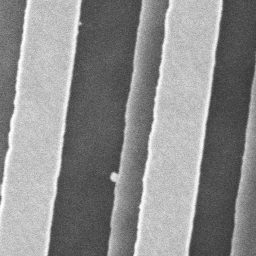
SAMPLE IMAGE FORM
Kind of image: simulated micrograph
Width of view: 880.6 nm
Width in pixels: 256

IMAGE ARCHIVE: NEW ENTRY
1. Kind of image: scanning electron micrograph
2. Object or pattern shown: lines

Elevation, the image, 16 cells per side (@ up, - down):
@@@@@----@@@@@--
@@@@@----@@@@@--
@@@@@----@@@@@--
@@@@@---@@@@@---
@@@@----@@@@@---
@@@@----@@@@@---
@@@@----@@@@@---
@@@@----@@@@@---
@@@@----@@@@@--@
@@@@----@@@@@--@
@@@@----@@@@@--@
@@@@---@@@@@---@
@@@----@@@@@---@
@@@----@@@@@---@
@@@----@@@@@---@
@@@----@@@@@--@@